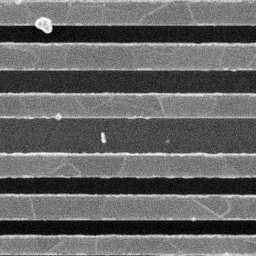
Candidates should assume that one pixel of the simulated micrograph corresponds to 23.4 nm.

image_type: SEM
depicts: lines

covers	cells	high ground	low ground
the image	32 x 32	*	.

********************************
********************************
********************************
.....**.........................
................................
*********************.**.*****.*
********************************
********************************
********************************
................................
................................
................................
********************************
********************************
********************************
................................
................................
................................
................................
********************************
********************************
********************************
................................
................................
********************************
********************************
********************************
........................*.......
................................
.***...**.*.***...***********..*
********************************
********************************